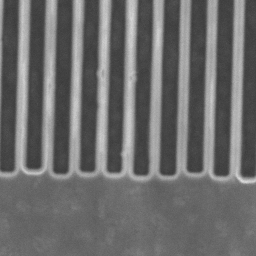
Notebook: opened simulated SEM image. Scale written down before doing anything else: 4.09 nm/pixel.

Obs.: parallel lines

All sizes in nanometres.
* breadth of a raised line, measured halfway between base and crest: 29.6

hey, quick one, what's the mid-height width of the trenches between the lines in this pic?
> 77.7 nanometers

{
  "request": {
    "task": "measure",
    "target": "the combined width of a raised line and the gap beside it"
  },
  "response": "110 nanometers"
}